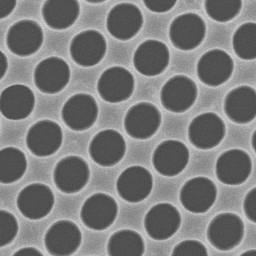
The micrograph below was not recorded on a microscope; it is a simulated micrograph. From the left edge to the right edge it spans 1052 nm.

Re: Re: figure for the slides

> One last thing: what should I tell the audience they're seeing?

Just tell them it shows a regular array of holes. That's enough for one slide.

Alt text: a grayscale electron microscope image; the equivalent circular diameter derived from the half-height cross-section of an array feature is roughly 144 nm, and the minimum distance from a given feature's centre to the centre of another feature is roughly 184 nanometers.